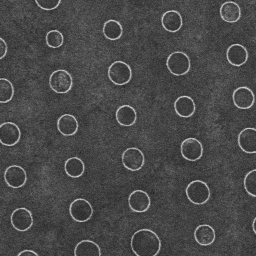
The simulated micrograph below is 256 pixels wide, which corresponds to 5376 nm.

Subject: a regular array of raised bodies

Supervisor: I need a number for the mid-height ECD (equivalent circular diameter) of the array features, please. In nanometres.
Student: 441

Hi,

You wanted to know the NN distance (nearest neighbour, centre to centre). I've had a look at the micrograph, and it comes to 903 nanometers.